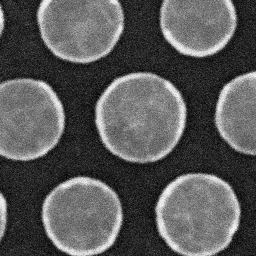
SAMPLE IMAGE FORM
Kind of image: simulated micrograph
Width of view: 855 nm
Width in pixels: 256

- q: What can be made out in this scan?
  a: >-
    raised bodies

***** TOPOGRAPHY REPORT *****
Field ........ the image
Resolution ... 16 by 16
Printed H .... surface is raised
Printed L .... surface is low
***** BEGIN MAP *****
LLLHHHHHLLHHHHHL
LLHHHHHHLLHHHHHL
LLLHHHHLLLLHHHLL
LLLLHHLLLLLLHLLL
LLLLLLLLLLLLLLLL
HHHLLLLHHHHLLLHH
HHHHLLHHHHHLLLHH
HHHHLLHHHHHLLLHH
HHHHLLHHHHHLLLHH
HHHLLLLHHHLLLLLH
LLLLLLLLLLLLLLLL
LLLLHHLLLLLHHHLL
LLLHHHHLLLHHHHHL
LLLHHHHHLLHHHHHL
LLLHHHHLLLHHHHHL
LLLLHHHLLLLHHHLL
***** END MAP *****